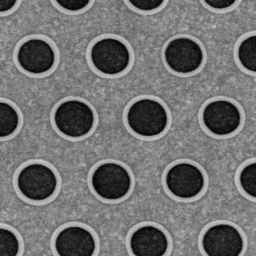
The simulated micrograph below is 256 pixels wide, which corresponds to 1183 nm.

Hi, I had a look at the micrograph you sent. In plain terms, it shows a regular array of holes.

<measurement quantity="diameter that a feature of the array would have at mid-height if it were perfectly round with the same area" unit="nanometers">190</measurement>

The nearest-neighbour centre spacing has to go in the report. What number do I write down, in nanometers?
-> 336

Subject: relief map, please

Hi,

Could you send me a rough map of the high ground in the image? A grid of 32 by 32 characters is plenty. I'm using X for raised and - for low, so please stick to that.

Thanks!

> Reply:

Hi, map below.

--XXXXX----XXXXX----XXXXXX---XXX
-XXXXXXX--XXXXXXXX-XXXXXXXXXXXXX
XXXXXXXXXXXXXXXXXXXXXXXXXXXXXXXX
XXXXXXXXXXXXXXXXXXXXXXXXXXXXXXXX
XXXXXXXXXXXXXXXXXXXXXXXXXXXXXXX-
XXX---XXXXXX----XXXXX----XXXXX--
XX-----XXXX-----XXXX------XXXX--
XX-----XXXX-----XXXXX-----XXXX--
XXX----XXXXX----XXXXX----XXXXX--
XXXXXXXXXXXXX-XXXXXXXXXXXXXXXXXX
XXXXXXXXXXXXXXXXXXXXXXXXXXXXXXXX
XXXXXXXXXXXXXXXXXXXXXXXXXXXXXXXX
XXXXXXXX--XXXXXXX---XXXXXXX--XXX
--XXXXX----XXXXX-----XXXX-----XX
---XXXX-----XXXX-----XXXX-----XX
---XXXX-----XXXX-----XXXX-----XX
--XXXXX----XXXXXX---XXXXXX---XXX
XXXXXXXXXXXXXXXXXXXXXXXXXXXXXXXX
XXXXXXXXXXXXXXXXXXXXXXXXXXXXXXXX
XXXXXXXXXXXXXXXXXXXXXXXXXXXXXXXX
XXX---XXXXXX---XXXXXXX--XXXXXXX-
XX-----XXXX-----XXXXX----XXXXX--
XX-----XXXX-----XXXXX-----XXXX--
XX-----XXXX-----XXXXX-----XXXX--
XXX----XXXXX----XXXXXX---XXXXXX-
XXXXXXXXXXXXXXXXXXXXXXXXXXXXXXXX
XXXXXXXXXXXXXXXXXXXXXXXXXXXXXXXX
XXXXXXXXXXXXXXXXXXXXXXXXXXXXXXXX
-XXXXXXX---XXXXXX---XXXXXX----XX
--XXXXX-----XXXX-----XXXX-----XX
---XXXX-----XXXX-----XXXX------X
---XXXX-----XXXX-----XXXX-----XX